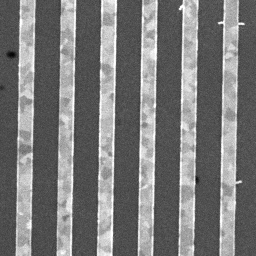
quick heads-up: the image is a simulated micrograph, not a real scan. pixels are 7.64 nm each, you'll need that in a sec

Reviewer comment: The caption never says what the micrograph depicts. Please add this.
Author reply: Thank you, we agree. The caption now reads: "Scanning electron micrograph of parallel lines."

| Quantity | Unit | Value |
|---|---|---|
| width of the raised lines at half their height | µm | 0.104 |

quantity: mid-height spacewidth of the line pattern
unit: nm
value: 208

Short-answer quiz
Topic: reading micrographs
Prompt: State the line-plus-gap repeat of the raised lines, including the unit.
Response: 311 nm